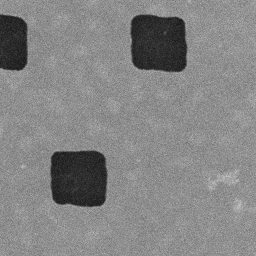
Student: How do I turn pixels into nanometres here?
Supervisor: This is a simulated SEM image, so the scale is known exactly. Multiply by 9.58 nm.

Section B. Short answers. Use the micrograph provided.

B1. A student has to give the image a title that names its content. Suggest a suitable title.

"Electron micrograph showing holes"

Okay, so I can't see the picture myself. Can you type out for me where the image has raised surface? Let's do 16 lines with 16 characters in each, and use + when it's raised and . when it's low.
++++++++++++++++
..++++++....++++
..++++++....++++
..++++++....++++
++++++++++++++++
++++++++++++++++
++++++++++++++++
++++++++++++++++
++++++++++++++++
++++..++++++++++
+++....+++++++++
+++....+++++++++
+++....+++++++++
++++++++++++++++
++++++++++++++++
++++++++++++++++